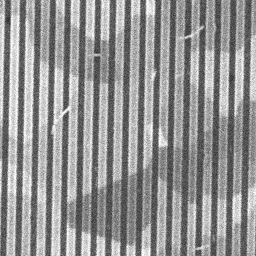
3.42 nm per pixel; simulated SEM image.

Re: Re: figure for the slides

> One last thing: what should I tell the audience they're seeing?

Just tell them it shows parallel lines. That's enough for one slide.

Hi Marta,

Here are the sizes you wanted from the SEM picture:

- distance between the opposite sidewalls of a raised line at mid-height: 26.1 nm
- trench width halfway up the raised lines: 26.1 nm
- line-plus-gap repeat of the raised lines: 51.3 nm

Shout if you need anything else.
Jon